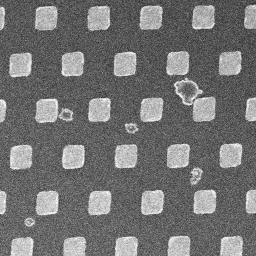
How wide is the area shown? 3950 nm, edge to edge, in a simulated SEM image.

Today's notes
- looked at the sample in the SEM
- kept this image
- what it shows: a regular array of raised bodies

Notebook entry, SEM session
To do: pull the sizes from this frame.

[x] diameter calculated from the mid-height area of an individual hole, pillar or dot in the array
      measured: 373 nm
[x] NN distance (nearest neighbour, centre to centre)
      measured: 0.803 micrometres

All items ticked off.